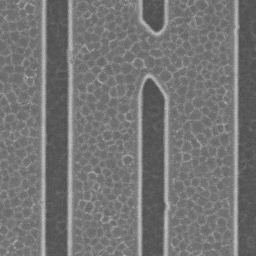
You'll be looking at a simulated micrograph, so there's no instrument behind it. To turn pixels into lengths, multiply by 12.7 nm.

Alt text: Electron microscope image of one or a few lines or trenches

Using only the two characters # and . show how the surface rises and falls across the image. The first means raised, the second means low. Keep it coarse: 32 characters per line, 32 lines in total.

#####....########....########...
#####....########....########...
#####....#########...########...
#####....##########.#########...
#####....####################...
#####....####################...
#####....####################...
#####....####################...
#####....####################...
#####....####################...
#####....#########..#########...
#####....#########..#########...
#####....########....########...
#####....########....########...
#####....########....########...
#####....########....########...
#####....########....########...
#####....########....########...
#####....########....########...
#####....########....########...
#####....########....########...
#####....########....########...
#####....########....########...
#####....########....########...
#####....########....########...
#####....########....########...
#####....########....########...
#####....########....########...
#####....########....########...
#####....########....########...
#####....########....########...
#####....########....########...